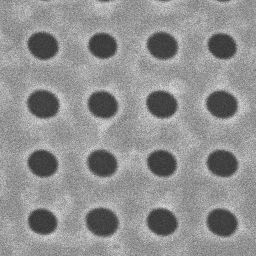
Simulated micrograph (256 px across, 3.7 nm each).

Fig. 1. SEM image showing a regular array of holes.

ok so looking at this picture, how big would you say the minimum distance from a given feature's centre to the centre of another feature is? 217 nanometres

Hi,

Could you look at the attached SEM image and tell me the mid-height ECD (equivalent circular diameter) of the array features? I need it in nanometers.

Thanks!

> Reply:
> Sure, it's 105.